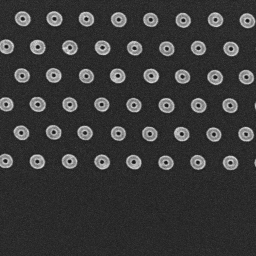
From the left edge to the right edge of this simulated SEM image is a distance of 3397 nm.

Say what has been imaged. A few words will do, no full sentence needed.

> a regular array of ring-shaped raised bodies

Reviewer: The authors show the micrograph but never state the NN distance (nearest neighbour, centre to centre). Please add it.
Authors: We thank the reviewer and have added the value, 421 nanometers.